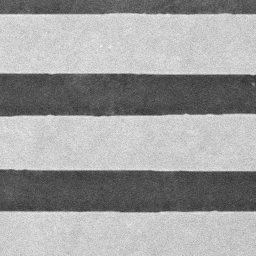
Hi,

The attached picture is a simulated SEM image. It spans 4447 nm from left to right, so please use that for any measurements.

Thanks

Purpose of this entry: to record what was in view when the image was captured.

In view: lines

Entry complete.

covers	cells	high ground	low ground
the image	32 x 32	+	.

................................
................................
++++++++++++++++++++++++++++++++
++++++++++++++++++++++++++++++++
++++++++++++++++++++++++++++++++
++++++++++++++++++++++++++++++++
++++++++++++++++++++++++++++++++
++++++++++++++++++++++++++++++++
++++++++++++++++++++++++++++++++
................................
................................
................................
................................
................................
......+.............++++++++++++
++++++++++++++++++++++++++++++++
++++++++++++++++++++++++++++++++
++++++++++++++++++++++++++++++++
++++++++++++++++++++++++++++++++
++++++++++++++++++++++++++++++++
++++++++++++++++++++++++++++++++
................................
................................
................................
................................
................................
..........................++....
++++++++++++++++++++++++++++++++
++++++++++++++++++++++++++++++++
++++++++++++++++++++++++++++++++
++++++++++++++++++++++++++++++++
++++++++++++++++++++++++++++++++